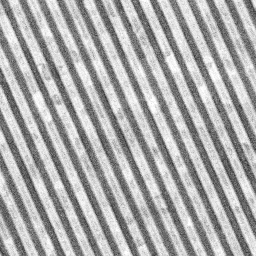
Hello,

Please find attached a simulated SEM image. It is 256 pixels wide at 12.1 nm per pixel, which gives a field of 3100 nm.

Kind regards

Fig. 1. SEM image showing parallel lines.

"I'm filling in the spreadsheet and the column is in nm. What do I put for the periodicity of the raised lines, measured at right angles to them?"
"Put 207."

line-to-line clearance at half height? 105 nanometers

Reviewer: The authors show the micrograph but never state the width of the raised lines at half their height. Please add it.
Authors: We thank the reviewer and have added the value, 0.0926 µm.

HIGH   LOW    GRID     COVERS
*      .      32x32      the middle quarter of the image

...**...**..***..**...**..**...*
*..**...**...**...**..**...**..*
*...**...**..***..**...**..**...
**..***..**..***..**...**...**..
**...**..**...**...**...**..**..
**...**...**...**..**...**..***.
.**...**..**...**..***..**...**.
.**...**...**..**...**...**..**.
..**...**..**...**..***..**...**
..**...**..***..**...**...**..**
..***..**...**...**..***..**...*
*..**...**..***..**...**..***..*
*...**..**...**..***..**...**...
**..**...**..**...**...**..***..
**..**...**...**..***..**...**..
**...**...**..**...**..***..**..
.**..**...**...**..***..**...**.
.**...**...**..**...**..***..**.
..**..**...**..***..**...**...**
..**...**..**...**...**..***..**
...**..**...**..***..**...**...*
...**...**..**...**...**..**...*
*..***..**...**..**...**...**..*
*...**..***..**...**...**..**...
**..**...**...**..**...**..***..
**...**..**...**...**...**..**..
***..**...**...**..**...**..***.
.**...**..**...**..***..**...**.
.***..**...**..**...**...**..***
..**..**...**...**..***..**...**
..**...**...**..**...**...**..**
...**..**...**...**..**...**...*